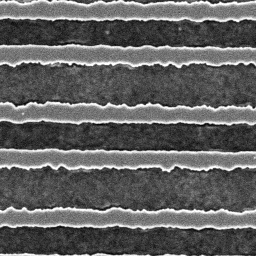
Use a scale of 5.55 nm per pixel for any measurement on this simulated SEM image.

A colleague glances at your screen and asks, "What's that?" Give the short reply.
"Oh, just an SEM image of lines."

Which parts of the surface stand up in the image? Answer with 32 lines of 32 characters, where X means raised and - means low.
XXXXXXXXXXXXXXXXXXXXXXXXXXXXXXXX
XXXXXXXXXXXXXXXXXXXXXXXXXXXXXXXX
----------X-X-----X--X--XX-XXX--
--------------------------------
--------------------------------
--------------------------------
XXXXXXXXXXXXXXXXXXXXXXXXXXXXXXXX
XXXXXXXXXXXXXXXXXXXXXXXXXXXXXXXX
--------------------------------
--------------------------------
--------------------------------
--------------------------------
--------------------------------
XXXXXXXXXXXXXXXXXXXXXXXXXXXXXXXX
XXXXXXXXXXXXXXXXXXXXXXXXXXXXXXXX
----------------------------X--X
--------------------------------
--------------------------------
--------------------------------
XXXXXXXXXXXXXXXXXXXXXXXXXXXXXXXX
XXXXXXXXXXXXXXXXXXXXXXXXXXXXXXXX
--------------------------------
--------------------------------
--------------------------------
--------------------------------
--------------------------------
XXXXXXXXXXXXXXXXXXXXXXXXXXXXX--X
XXXXXXXXXXXXXXXXXXXXXXXXXXXXXXXX
----------------XXX---XXXX-XXX--
--------------------------------
--------------------------------
--------------------------------